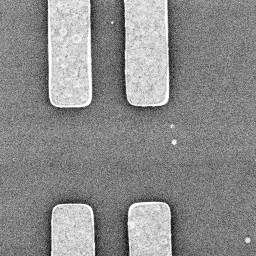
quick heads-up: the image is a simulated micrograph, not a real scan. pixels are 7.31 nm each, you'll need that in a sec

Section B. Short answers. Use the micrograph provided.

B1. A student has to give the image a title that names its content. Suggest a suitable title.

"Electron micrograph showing groups of lines, slits or small figures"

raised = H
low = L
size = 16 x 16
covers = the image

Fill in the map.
LLLHHHLLHHLLLLLL
LLLHHHLLHHLLLLLL
LLLHHHLLHHLLLLLL
LLLHHHLLHHLLLLLL
LLLHHHLLHHLLLLLL
LLLHHHLLHHLLLLLL
LLLHHLLLHHLLLLLL
LLLLLLLLLLLLLLLL
LLLLLLLLLLLLLLLL
LLLLLLLLLLLLLLLL
LLLLLLLLLLLLLLLL
LLLLLLLLLLLLLLLL
LLLLLLLLLLLLLLLL
LLLHHHLLHHHLLLLL
LLLHHHLLHHHLLLLL
LLLHHHLLHHHLLLLL